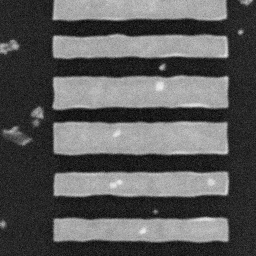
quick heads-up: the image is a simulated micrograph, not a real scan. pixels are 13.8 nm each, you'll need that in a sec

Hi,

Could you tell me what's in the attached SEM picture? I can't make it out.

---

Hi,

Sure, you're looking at groups of lines, slits or small figures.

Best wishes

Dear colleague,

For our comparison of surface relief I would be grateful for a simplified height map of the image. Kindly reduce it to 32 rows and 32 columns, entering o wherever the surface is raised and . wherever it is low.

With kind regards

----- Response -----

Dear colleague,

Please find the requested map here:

.......ooooooooooooooooooooo....
.......ooooooooooooooooooooo....
................................
................................
..............o..........o......
.......ooooooooooooooooooooo....
.......ooooooooooooooooooooo....
................................
................................
................................
.......ooooooooooooooooooooo....
.......ooooooooooooooooooooo....
.......ooooooooooooooooooooo....
.......oo.......................
................................
.......ooooooooooooooooooooo....
.......ooooooooooooooooooooo....
.......ooooooooooooooooooooo....
.......ooooooooooooooooooooo....
................................
................................
................................
.......ooooooooooooooooooooo....
.......ooooooooooooooooooooo....
......................oo........
................................
................................
.......ooooooooooooooooooooo....
.......ooooooooooooooooooooo....
.......ooooooooooooooooooooo....
................................
................................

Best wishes